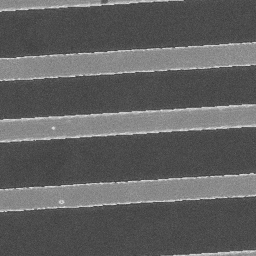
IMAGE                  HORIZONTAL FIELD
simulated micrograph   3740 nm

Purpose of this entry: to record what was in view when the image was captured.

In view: lines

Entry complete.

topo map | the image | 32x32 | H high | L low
HHHHHHHHHHHHHHLLLLLLLLLLLLLLLLLL
LLLLLLLLLLLLLLLLLLLLLLLLLLLLLLLL
LLLLLLLLLLLLLLLLLLLLLLLLLLLLLLLL
LLLLLLLLLLLLLLLLLLLLLLLLLLLLLLLL
LLLLLLLLLLLLLLLLLLLLLLLLLLLLLLLL
LLLLLLLLLLLLLLLLLLLLLLLLLLLLLLHH
LLLLLLLLLLLLLHHHHHHHHHHHHHHHHHHH
HHHHHHHHHHHHHHHHHHHHHHHHHHHHHHHH
HHHHHHHHHHHHHHHHHHHHHHHHHLLLLLLL
HHHHHHHHHHLLLLLLLLLLLLLLLLLLLLLL
LLLLLLLLLLLLLLLLLLLLLLLLLLLLLLLL
LLLLLLLLLLLLLLLLLLLLLLLLLLLLLLLL
LLLLLLLLLLLLLLLLLLLLLLLLLLLLLLLL
LLLLLLLLLLLLLLLLLLLLLLLLLHHHHHHH
LLLLLLLLLLHHHHHHHHHHHHHHHHHHHHHH
HHHHHHHHHHHHHHHHHHHHHHHHHHHHHHHH
HHHHHHHHHHHHHHHHHHHHLLLLLLLLLLLL
HHHHLLLLLLLLLLLLLLLLLLLLLLLLLLLL
LLLLLLLLLLLLLLLLLLLLLLLLLLLLLLLL
LLLLLLLLLLLLLLLLLLLLLLLLLLLLLLLL
LLLLLLLLLLLLLLLLLLLLLLLLLLLLLLLL
LLLLLLLLLLLLLLLLLLLLLLLLLLLLLLLL
LLLLLLLLLLLLLLLLLLLHHHHHHHHHHHHH
LLLHHHHHHHHHHHHHHHHHHHHHHHHHHHHH
HHHHHHHHHHHHHHHHHHHHHHHHHHHHHHHL
HHHHHHHHHHHHHHHLLLLLLLLLLLLLLLLL
LLLLLLLLLLLLLLLLLLLLLLLLLLLLLLLL
LLLLLLLLLLLLLLLLLLLLLLLLLLLLLLLL
LLLLLLLLLLLLLLLLLLLLLLLLLLLLLLLL
LLLLLLLLLLLLLLLLLLLLLLLLLLLLLLLL
LLLLLLLLLLLLLLLLLLLLLLLLLLLLLLLL
LLLLLLLLLLLLLLLLLLLLLLLLLLLLLHHH